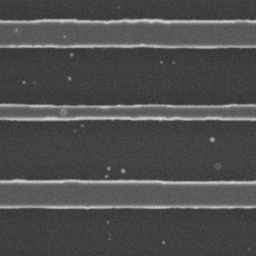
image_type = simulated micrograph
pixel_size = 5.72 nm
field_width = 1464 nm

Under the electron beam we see lines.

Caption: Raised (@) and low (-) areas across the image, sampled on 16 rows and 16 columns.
----------------
@@@@@@@@@@@@@@@@
@@@@@@@@@@@@@@@@
----------------
----------------
----------------
----------------
----------------
----------------
----------------
----------------
@@@@@@@@@@@@@@@@
@@@@@@@@@@@@@@@@
----------------
----------------
----------------